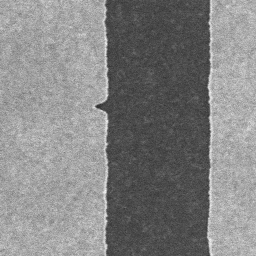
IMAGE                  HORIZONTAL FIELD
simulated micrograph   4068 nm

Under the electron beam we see one or a few lines or trenches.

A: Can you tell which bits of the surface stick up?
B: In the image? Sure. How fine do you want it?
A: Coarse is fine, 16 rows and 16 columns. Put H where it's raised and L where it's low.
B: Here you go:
HHHHHHHLLLLLLHHH
HHHHHHHLLLLLLHHH
HHHHHHHLLLLLLHHH
HHHHHHHLLLLLLHHH
HHHHHHHLLLLLLHHH
HHHHHHHLLLLLLHHH
HHHHHHLLLLLLLHHH
HHHHHHHLLLLLLHHH
HHHHHHHLLLLLLHHH
HHHHHHHLLLLLLHHH
HHHHHHHLLLLLLHHH
HHHHHHHLLLLLLHHH
HHHHHHHLLLLLLHHH
HHHHHHHLLLLLLHHH
HHHHHHHLLLLLLHHH
HHHHHHHLLLLLLHHH